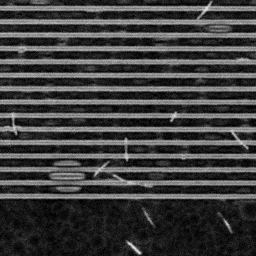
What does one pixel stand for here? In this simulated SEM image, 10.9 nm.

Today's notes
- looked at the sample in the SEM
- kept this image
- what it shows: parallel lines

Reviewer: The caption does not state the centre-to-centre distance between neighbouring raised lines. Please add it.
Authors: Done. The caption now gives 146 nm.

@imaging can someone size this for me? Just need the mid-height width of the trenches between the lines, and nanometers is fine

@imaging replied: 110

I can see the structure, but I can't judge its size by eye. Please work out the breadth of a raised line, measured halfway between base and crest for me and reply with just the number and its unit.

39.4 nm